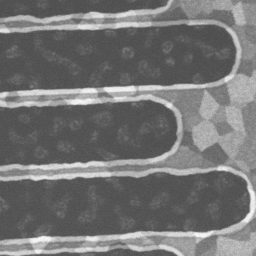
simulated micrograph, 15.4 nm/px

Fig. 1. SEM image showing one or a few lines or trenches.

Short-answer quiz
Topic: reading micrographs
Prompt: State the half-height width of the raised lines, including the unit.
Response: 161 nanometres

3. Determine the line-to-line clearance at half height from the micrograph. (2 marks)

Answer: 983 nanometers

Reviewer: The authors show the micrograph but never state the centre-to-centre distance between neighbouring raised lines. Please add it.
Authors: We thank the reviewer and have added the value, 74.1 pixels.